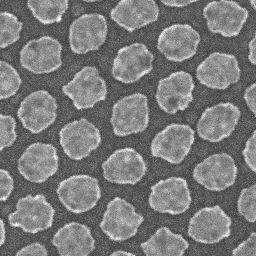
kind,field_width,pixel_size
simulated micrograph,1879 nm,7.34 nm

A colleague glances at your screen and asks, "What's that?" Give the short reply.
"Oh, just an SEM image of a regular array of raised bodies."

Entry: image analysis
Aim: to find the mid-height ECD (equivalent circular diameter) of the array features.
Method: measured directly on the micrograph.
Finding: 282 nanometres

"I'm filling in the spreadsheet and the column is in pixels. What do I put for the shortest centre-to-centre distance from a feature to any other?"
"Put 49.5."